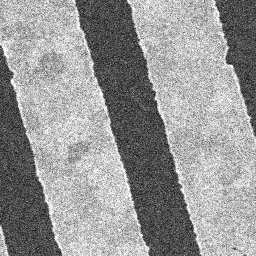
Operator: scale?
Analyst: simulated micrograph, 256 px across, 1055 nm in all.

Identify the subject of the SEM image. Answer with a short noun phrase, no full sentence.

one or a few lines or trenches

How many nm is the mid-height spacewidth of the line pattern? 216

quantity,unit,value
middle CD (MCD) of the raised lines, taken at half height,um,0.334